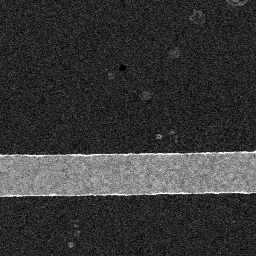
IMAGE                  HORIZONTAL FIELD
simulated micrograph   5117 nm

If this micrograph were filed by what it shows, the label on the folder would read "one or a few lines or trenches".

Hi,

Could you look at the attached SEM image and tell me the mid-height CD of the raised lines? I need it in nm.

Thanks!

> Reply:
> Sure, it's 810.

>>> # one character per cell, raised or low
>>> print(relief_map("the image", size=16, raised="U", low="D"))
DDDDDDDDDDDDDDDD
DDDDDDDDDDDDDDDD
DDDDDDDDDDDDDDDD
DDDDDDDDDDDDDDDD
DDDDDDDDDDDDDDDD
DDDDDDDDDDDDDDDD
DDDDDDDDDDDDDDDD
DDDDDDDDDDDDDDDD
DDDDDDDDDDDDDDDD
DDDDDDDDDDDDDDDU
UUUUUUUUUUUUUUUU
UUUUUUUUUUUUUUUU
DDDDDDDDDDDDDDDD
DDDDDDDDDDDDDDDD
DDDDDDDDDDDDDDDD
DDDDDDDDDDDDDDDD